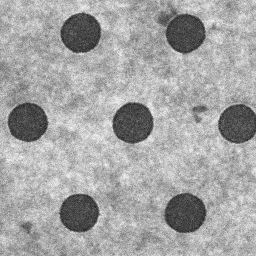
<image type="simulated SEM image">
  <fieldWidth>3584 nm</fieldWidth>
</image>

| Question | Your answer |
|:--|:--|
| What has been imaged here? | holes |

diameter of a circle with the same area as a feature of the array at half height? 0.575 micrometres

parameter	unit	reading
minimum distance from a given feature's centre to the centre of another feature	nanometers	1450